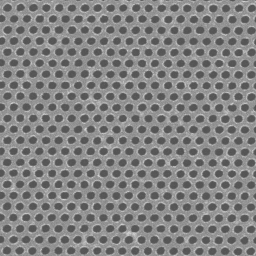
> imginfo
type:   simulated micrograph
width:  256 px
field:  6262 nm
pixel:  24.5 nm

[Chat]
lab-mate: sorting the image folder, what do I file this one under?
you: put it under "a regular array of holes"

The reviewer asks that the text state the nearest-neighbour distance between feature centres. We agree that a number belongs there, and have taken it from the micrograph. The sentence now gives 0.303 microns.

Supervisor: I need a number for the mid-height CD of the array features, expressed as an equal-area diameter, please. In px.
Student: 8.29